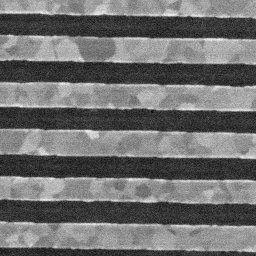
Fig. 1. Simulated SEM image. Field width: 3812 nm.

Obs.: lines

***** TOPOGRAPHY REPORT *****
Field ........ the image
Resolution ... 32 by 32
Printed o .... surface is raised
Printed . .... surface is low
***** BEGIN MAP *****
oooooooooooooooooooooooooooooooo
oooooooooooooooooooooooooooooooo
................................
................................
oo..............................
oooooooooooooooooooooooooooooooo
oooooooooooooooooooooooooooooooo
oo.ooooooooooooooooooooooooooooo
................................
................................
oo.oooooo.......................
oooooooooooooooooooooooooooooooo
oooooooooooooooooooooooooooooooo
...............oo.oooooooooooooo
................................
................................
oooooooooooooooooooo............
oooooooooooooooooooooooooooooooo
oooooooooooooooooooooooooooooooo
..............oooooooooooooooooo
................................
................................
ooooooooooooooooooooo...........
oooooooooooooooooooooooooooooooo
oooooooooooooooooooooooooooooooo
................................
................................
................................
oooooooooooooooooooooooooooooooo
oooooooooooooooooooooooooooooooo
oooooooooooooooooooooooooooooooo
................................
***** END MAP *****